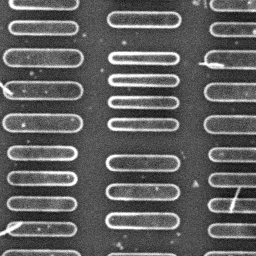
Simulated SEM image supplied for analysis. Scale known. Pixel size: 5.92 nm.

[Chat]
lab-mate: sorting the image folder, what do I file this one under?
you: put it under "groups of lines, slits or small figures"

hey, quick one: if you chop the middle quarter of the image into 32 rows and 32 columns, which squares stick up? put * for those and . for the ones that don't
****............................
................................
................................
............****************....
............*****************...
****....................****....
*****...........................
*****...........................
****........****************....
...........******************...
............****************....
................................
................................
****............................
*****......*****************....
*****......******************...
****.................******.....
................................
................................
................................
................................
***.............................
***.............................
**.........*****************....
...........******************...
...........******************...
.............***************....
**..............................
***.............................
***.............................
...........*****************....
...........******************...